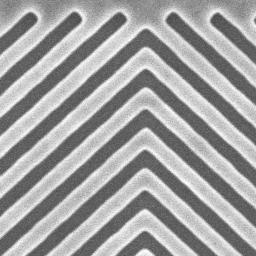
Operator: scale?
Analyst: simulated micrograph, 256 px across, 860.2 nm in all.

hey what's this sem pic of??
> groups of lines, slits or small figures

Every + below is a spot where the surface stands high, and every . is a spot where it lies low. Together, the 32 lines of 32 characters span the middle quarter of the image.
....+++++......+++++++++++.....+
...+++++......+++++...+++++.....
..+++++......+++++.....+++++....
++++++......+++++.......+++++...
+++++.....++++++.........+++++..
++++.....++++++...........+++++.
+++.....++++++.....+++.....+++++
++.....++++++.....+++++.....++++
+.....++++++.....+++++++.....+++
.....++++++.....+++++++++.....++
....+++++......+++++++++++.....+
...+++++......+++++..++++++.....
..+++++......+++++....++++++....
++++++......+++++......++++++...
+++++......+++++.........+++++..
++++.....++++++...........+++++.
+++.....++++++......+......+++++
++.....++++++.....++++......++++
......+++++......++++++......+++
.....+++++......+++++++++.....++
....+++++......+++++++++++.....+
...+++++......++++++.++++++.....
..+++++......+++++....++++++....
++++++.....++++++......++++++...
+++++......+++++........++++++..
++++......+++++..........++++++.
+++.....++++++......+.....++++++
++.....++++++.....++++......++++
+.....++++++.....++++++......+++
.....++++++.....++++++++......++
....++++++.....++++++++++......+
...+++++......++++++.+++++......